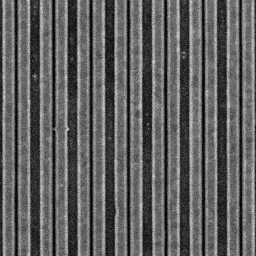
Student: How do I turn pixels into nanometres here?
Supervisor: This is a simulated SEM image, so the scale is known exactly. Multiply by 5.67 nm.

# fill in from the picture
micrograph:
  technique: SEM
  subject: parallel lines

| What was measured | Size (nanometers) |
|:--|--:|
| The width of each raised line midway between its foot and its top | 55.3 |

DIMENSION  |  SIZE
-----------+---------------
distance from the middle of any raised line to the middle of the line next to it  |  105 nm